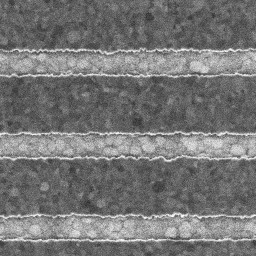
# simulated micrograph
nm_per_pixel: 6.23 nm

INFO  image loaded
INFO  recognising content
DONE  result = one or a few lines or trenches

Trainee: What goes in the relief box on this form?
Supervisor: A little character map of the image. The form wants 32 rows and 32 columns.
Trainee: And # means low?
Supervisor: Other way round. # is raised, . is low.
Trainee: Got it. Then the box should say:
################################
################################
################################
################################
################################
################################
.............#..................
................................
........................#.......
#####################.####.#####
################################
################################
################################
################################
################################
################################
################################
................................
................................
......................#.........
################################
################################
################################
################################
################################
################################
################################
................................
................................
................................
################################
################################